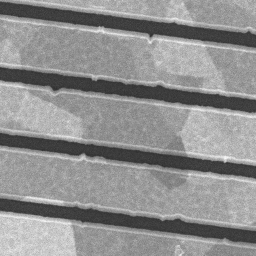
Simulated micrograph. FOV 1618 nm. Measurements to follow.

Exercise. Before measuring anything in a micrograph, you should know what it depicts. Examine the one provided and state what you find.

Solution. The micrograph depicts one or a few lines or trenches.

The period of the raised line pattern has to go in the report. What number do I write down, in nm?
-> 410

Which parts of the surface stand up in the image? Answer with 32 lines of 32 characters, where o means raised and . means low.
.....ooooooooooooooooooooooooooo
.............ooooooooooooooooooo
oo..................oooooooooooo
oooooooooo..................oooo
oooooooooooooooooo..............
oooooooooooooooooooooooooo......
oooooooooooooooooooooooooooooooo
oooooooooooooooooooooooooooooooo
...ooooooooooooooooooooooooooooo
...........ooooooooooooooooooooo
o.................o.oooooooooooo
oooooooooo................oooooo
ooooooooooooooooo...............
ooooooooooooooooooooooooo.......
oooooooooooooooooooooooooooooooo
oooooooooooooooooooooooooooooooo
.ooooooooooooooooooooooooooooooo
..........oooooooooooooooooooooo
.................ooooooooooooooo
oooooooo.................ooooooo
oooooooooooooooo................
ooooooooooooooooooooooo.........
ooooooooooooooooooooooooooooooo.
oooooooooooooooooooooooooooooooo
oooooooooooooooooooooooooooooooo
........oooooooooooooooooooooooo
................oooooooooooooooo
oooooo..................oooooooo
oooooooooooooo.................o
oooooooooooooooooooooo..........
oooooooooooooooooooooooooooooo..
oooooooooooooooooooooooooooooooo